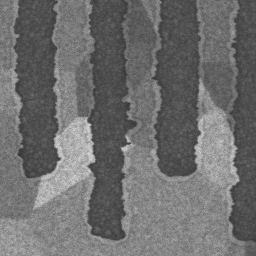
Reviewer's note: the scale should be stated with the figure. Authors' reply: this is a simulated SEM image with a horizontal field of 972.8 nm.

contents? one or a few lines or trenches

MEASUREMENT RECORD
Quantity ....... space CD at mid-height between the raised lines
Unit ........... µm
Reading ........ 0.155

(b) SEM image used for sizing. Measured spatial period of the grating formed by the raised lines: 0.272 um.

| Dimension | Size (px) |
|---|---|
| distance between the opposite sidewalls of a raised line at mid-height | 31.8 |